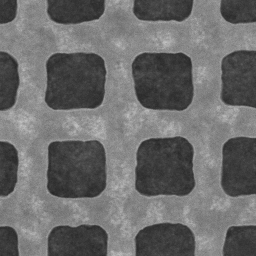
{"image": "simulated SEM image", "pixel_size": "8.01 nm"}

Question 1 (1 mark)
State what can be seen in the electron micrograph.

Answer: holes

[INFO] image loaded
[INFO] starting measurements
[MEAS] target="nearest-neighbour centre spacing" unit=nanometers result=698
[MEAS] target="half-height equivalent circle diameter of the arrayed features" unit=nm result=507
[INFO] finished